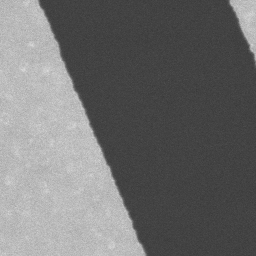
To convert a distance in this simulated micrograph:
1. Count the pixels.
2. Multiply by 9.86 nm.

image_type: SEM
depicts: one or a few lines or trenches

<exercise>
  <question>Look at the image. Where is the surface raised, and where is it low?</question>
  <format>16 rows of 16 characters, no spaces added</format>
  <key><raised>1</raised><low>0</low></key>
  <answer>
0011111111111110
0001111111111110
0001111111111111
0000111111111111
0000111111111111
0000011111111111
0000011111111111
0000011111111111
0000001111111111
0000001111111111
0000000111111111
0000000111111111
0000000011111111
0000000011111111
0000000011111111
0000000001111111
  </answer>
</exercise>